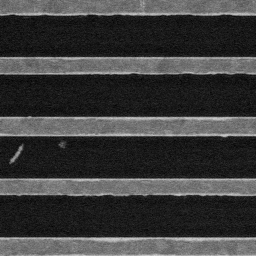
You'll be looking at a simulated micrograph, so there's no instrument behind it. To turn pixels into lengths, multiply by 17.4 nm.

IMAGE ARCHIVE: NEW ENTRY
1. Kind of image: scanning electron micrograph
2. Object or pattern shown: lines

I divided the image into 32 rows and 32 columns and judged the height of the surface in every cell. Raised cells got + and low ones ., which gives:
++++++++++++++++++++++++++++++++
++++++++++++++++++++++++++++++++
................................
................................
................................
................................
................................
++++++++++++++++++++++++++++++++
++++++++++++++++++++++++++++++++
................................
................................
................................
................................
................................
................................
++++++++++++++++++++++++++++++++
++++++++++++++++++++++++++++++++
................................
................................
................................
................................
................................
++++++++++++++++++++++++++++++++
++++++++++++++++++++++++++++++++
................................
................................
................................
................................
................................
................................
++++++++++++++++++++++++++++++++
++++++++++++++++++++++++++++++++